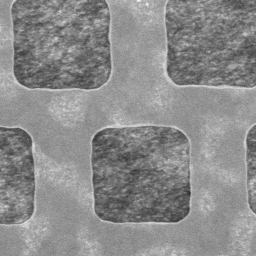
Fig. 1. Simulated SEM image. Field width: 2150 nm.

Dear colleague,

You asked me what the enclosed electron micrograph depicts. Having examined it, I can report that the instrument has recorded holes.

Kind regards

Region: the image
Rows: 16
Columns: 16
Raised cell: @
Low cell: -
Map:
@------@@@------
@------@@@------
@------@@@------
@------@@@------
@------@@@------
@@----@@@@@@@@@-
@@@@@@@@@@@@@@@@
@@@@@@@@@@@@@@@@
--@@@@------@@@-
--@@@@------@@@-
--@@@@------@@@-
--@@@@------@@@-
--@@@@------@@@@
--@@@@------@@@@
@@@@@@@@@@@@@@@@
@@@@@@@@@@@@@@@@